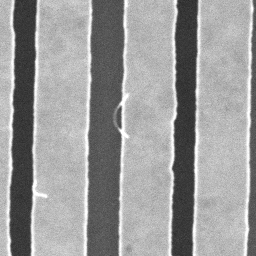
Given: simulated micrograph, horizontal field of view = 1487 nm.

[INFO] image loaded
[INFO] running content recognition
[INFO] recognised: lines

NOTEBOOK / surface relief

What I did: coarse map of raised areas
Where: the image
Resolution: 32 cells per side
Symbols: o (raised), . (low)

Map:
oo...oooooo.....oooooo...ooooooo
oo...oooooo.....oooooo...ooooooo
oo...oooooo.....oooooo...oooooo.
oo...oooooo.....oooooo...oooooo.
oo..ooooooo.....oooooo...oooooo.
oo..ooooooo.....oooooo...oooooo.
oo..ooooooo.....oooooo...oooooo.
oo..ooooooo.....oooooo...oooooo.
oo..ooooooo.....oooooo...oooooo.
oo..ooooooo.....oooooo...oooooo.
oo..ooooooo....ooooooo...oooooo.
oo..ooooooo....ooooooo...oooooo.
oo..ooooooo....ooooooo...oooooo.
oo..ooooooo....ooooooo...oooooo.
oo..ooooooo....ooooooo...oooooo.
oo..ooooooo....ooooooo...oooooo.
oo..ooooooo....ooooooo..ooooooo.
oo..ooooooo....ooooooo...oooooo.
o...ooooooo....ooooooo..ooooooo.
o...ooooooo....ooooooo..ooooooo.
oo..ooooooo....ooooooo..ooooooo.
oo..ooooooo....ooooooo..ooooooo.
o...ooooooo....ooooooo..ooooooo.
o...ooooooo....ooooooo..ooooooo.
o...ooooooo....ooooooo..ooooooo.
o...ooooooo....oooooo...ooooooo.
o...ooooooo....oooooo...ooooooo.
o...ooooooo....oooooo...ooooooo.
o...ooooooo....oooooo...ooooooo.
o...ooooooo....oooooo...ooooooo.
o...ooooooo....oooooo...ooooooo.
o...ooooooo....oooooo...ooooooo.